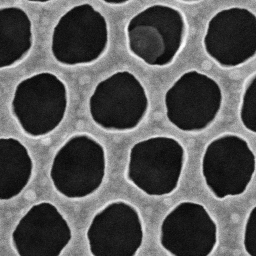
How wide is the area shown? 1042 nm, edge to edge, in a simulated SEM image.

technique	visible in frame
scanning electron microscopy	a regular array of holes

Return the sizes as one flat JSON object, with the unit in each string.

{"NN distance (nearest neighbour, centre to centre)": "301 nanometers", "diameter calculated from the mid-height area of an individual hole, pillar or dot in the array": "236 nm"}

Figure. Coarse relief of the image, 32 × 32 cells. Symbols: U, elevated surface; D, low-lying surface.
UUUUUUUUUUUUUUDUUUUUUUUUUUUUUUUU
DDDUUUUUDDDDUUUUUUDDDDUUUUUDDDDU
DDDDUUUDDDDDDUUUDDDDDDDUUUDDDDDD
DDDDUUUDDDDDDUUUDDDDDDDUUUDDDDDD
DDDDUUUDDDDDDDUUDDDDDDDUUUDDDDDD
DDDDUUDDDDDDDUUUDDDDDDDUUUDDDDDD
DDDUUUDDDDDDDUUUUDDDDDUUUUDDDDDD
DDUUUUUDDDDDUUUUUUDDDDUUUUUDDDDU
UUUUUUUUUUUUUUUUUUUUUUUUUUUUUUUU
UUUUDDDUUUUUUUDDDUUUUUUDDDUUUUUU
UUDDDDDDUUUUDDDDDDUUUUDDDDDUUUUD
UUDDDDDDUUUUDDDDDDUUUDDDDDDDUUUD
UUDDDDDDUUUDDDDDDDUUUDDDDDDDUUDD
UDDDDDDDUUUDDDDDDDUUUDDDDDDUUUDD
UUDDDDDDUUUDDDDDDDUUUDDDDDDUUUDD
UUDDDDDUUUUUDDDDDUUUUUDDDDUUUUDD
UUUDDDUUUUUUUUUUUUUUUUUUUUUUUUUU
DDUUUUUUUDDDUUUUUUDDDDUUUUUDDDUU
DDDUUUUUDDDDDUUUUDDDDDDUUUDDDDDU
DDDDUUUDDDDDDUUUDDDDDDDUUDDDDDDD
DDDDUUUDDDDDDUUUDDDDDDDUUDDDDDDD
DDDDUUDDDDDDDUUUDDDDDDDUUDDDDDDD
DDDDUUUDDDDDDUUUDDDDDDUUUUDDDDDU
DDDUUUUDDDDDUUUUUDDDDDUUUUDDDDDU
DDUUUUUUDDDUUUUUUUUUUUUUUUUDUUUU
UUUUUDUUUUUUUUDDUUUUUUDDDUUUUUUU
UUUDDDDUUUUUDDDDDUUUUDDDDDUUUUUD
UUUDDDDDUUUUDDDDDUUUUDDDDDDUUUUD
UUDDDDDDDUUDDDDDDDUUDDDDDDDUUUUD
UDDDDDDDDUUDDDDDDDUUDDDDDDDUUUDD
UUDDDDDDUUUDDDDDDDUUDDDDDDDUUUUD
UUDDDDDDUUUDDDDDDUUUUDDDDDUUUUUD